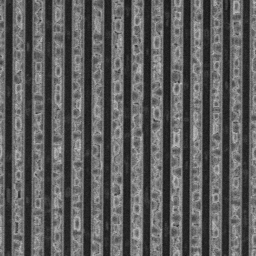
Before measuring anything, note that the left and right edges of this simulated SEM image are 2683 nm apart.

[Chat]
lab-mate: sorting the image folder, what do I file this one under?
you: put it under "parallel lines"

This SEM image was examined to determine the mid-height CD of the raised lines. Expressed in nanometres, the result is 126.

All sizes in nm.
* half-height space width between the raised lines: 81.2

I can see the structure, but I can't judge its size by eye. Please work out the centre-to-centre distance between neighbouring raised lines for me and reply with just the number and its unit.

207 nm